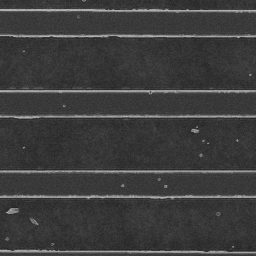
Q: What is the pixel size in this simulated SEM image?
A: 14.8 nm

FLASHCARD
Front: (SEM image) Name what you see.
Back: lines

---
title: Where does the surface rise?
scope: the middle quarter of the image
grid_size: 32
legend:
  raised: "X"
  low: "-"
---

--------------------------------
--------------------------------
--------------------------------
--------------------------------
--------------------------------
--------------------------------
--------------------------------
XXXXXXXXXXXXXXXXXXXXXXXXXXXXXXXX
XXXXXXXXXXXXXXXXXXXXXXXXXXXXXXXX
XXXXXXXXXXXXXXXXXXXXXXXXXXXXXXXX
XXXXXXXXXXXXXXXXXXXXXXXXXXXXXXXX
XXXXXXXXXXXXXXXXXXXXXXXXXXXXXXXX
XXXXXXXXXXXXXXXXXXXXXXXXXXXXXXXX
--------------------------------
--------------------------------
--------------------------------
--------------------------------
--------------------------------
--------------------------------
--------------------------------
--------------------------------
--------------------------------
--------------------------------
--------------------------------
--------------------------------
--------------------------------
--------------------------------
XXXXXXXXXXXXXXXXXXXXXXXXXXXXXXXX
XXXXXXXXXXXXXXXXXXXXXXXXXXXXXXXX
XXXXXXXXXXXXXXXXXXXXXXXXXXXXXXXX
XXXXXXXXXXXXXXXXXXXXXXXXXXXXXXXX
XXXXXXXXXXXXXXXXXXXXXXXXXXXXXXXX